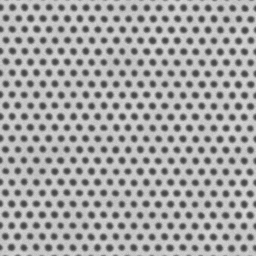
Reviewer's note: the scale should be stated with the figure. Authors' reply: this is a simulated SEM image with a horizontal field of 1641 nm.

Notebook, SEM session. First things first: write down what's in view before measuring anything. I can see a regular array of holes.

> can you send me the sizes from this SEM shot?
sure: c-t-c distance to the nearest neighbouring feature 76.6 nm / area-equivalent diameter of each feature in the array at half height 45.2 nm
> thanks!